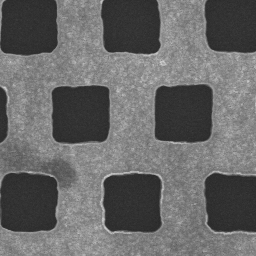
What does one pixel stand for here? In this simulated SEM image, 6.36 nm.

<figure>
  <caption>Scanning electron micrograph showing holes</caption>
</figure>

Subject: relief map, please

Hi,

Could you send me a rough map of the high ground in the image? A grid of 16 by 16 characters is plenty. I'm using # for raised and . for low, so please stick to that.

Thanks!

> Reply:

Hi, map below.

....##....###...
....##....###...
....##....###...
################
################
####...###...###
###....###...###
###....###...###
###....###...###
################
################
....###...###...
....##....###...
....###...###...
#.#############.
################